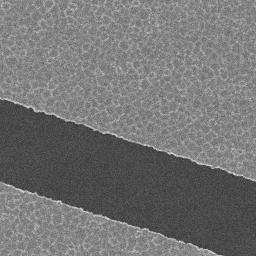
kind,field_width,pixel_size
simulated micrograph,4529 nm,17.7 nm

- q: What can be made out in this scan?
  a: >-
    one or a few lines or trenches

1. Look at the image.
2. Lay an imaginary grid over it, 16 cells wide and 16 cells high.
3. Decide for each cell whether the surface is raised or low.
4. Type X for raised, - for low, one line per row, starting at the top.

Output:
XXXXXXXXXXXXXXXX
XXXXXXXXXXXXXXXX
XXXXXXXXXXXXXXXX
XXXXXXXXXXXXXXXX
XXXXXXXXXXXXXXXX
XXXXXXXXXXXXXXXX
-XXXXXXXXXXXXXXX
----XXXXXXXXXXXX
-------XXXXXXXXX
----------XXXXXX
--------------XX
----------------
XXX-------------
XXXXXX----------
XXXXXXXXXX------
XXXXXXXXXXXXX---